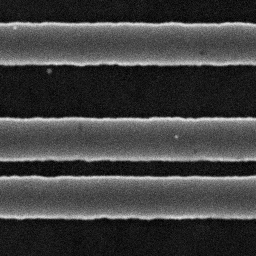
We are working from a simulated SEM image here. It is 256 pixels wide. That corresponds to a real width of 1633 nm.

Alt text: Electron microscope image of lines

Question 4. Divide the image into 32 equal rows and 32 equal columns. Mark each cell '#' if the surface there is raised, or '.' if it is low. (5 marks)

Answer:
................................
................................
................................
################################
################################
################################
################################
################################
................................
................................
................................
................................
................................
................................
................................
################################
################################
################################
################################
################################
................................
................................
################################
################################
################################
################################
################################
................................
................................
................................
................................
................................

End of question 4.